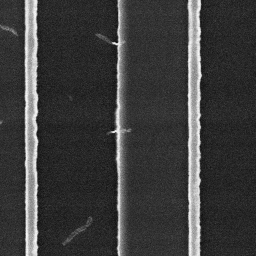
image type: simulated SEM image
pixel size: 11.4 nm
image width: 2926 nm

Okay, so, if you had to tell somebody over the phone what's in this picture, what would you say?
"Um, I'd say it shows lines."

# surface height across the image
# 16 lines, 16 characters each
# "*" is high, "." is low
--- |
**.....******...
**.....*****....
**.....*****....
**.....*****....
**.....******...
**.....*****....
**.....*****....
**.....*****....
**.....*****....
**.....*****....
**.....*****....
**.....*****....
**.....*****....
**.....*****....
**.....*****....
**.....*****....